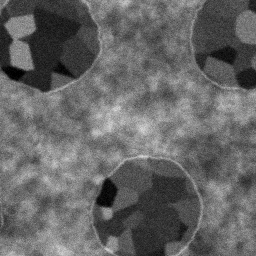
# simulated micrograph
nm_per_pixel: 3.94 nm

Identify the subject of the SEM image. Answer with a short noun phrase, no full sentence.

raised bodies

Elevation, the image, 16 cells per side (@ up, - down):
@@@@@@------@@@@
@@@@@@------@@@@
@@@@@@------@@@@
@@@@@@------@@@@
@@@@@--------@@@
--@@----------@@
----------------
----------------
----------------
----------------
-------@@@@-----
------@@@@@@----
------@@@@@@@---
------@@@@@@@---
------@@@@@@----
-------@@@@@----